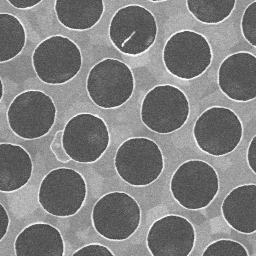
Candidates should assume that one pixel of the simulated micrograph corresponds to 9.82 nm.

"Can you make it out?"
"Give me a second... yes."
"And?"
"a regular array of holes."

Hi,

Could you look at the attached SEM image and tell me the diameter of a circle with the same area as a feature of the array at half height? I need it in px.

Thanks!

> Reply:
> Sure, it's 48.1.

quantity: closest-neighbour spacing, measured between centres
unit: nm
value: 573